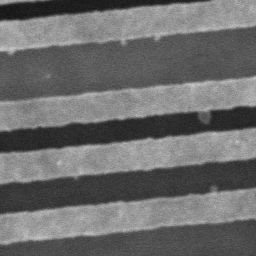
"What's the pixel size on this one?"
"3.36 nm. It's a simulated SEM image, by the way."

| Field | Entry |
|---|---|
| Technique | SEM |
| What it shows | lines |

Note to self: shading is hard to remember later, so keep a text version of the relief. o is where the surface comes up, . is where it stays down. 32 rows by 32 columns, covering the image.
o.......................oooooooo
.............ooooooooooooooooooo
...ooooooooooooooooooooooooooooo
oooooooooooooooooooooooooooo....
ooooooooooooooooooo.............
ooooooooo.......................
................................
................................
................................
................................
.......................ooooooooo
.............ooooooooooooooooooo
....oooooooooooooooooooooooooooo
ooooooooooooooooooooooooooooo...
ooooooooooooooooooo.............
oooooooo........................
............................oooo
..................oooooooooooooo
........oooooooooooooooooooooooo
oooooooooooooooooooooooooooooooo
ooooooooooooooooooooooooo.......
oooooooooooooo..................
oooo............................
................................
.......................ooooooooo
..............oooooooooooooooooo
.....ooooooooooooooooooooooooooo
ooooooooooooooooooooooooooooo...
ooooooooooooooooooo.............
ooooooooo.......................
................................
................................